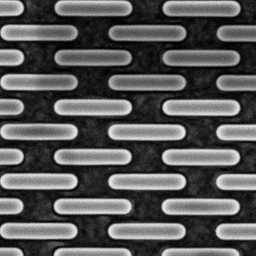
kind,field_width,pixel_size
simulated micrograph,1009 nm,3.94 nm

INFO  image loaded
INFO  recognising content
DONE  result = groups of lines, slits or small figures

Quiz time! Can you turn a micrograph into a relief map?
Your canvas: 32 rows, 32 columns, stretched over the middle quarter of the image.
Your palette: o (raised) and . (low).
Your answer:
................................
................................
................................
ooo.........oooooooooooooooooo..
ooo........ooooooooooooooooooo..
ooo........ooooooooooooooooooo..
................................
................................
................................
oooooooooooooooo.........ooooooo
ooooooooooooooooo........ooooooo
ooooooooooooooooo........ooooooo
oooooooooooooooo..........oooooo
................................
................................
oo..........ooooooooooooooooo...
ooo........ooooooooooooooooooo..
ooo........ooooooooooooooooooo..
oo..........oooooooooooooooooo..
................................
................................
oooooooooooooooo..........oooooo
ooooooooooooooooo........ooooooo
ooooooooooooooooo........ooooooo
oooooooooooooooo.........ooooooo
................................
................................
................................
ooo.........oooooooooooooooooo..
ooo........ooooooooooooooooooo..
ooo.........oooooooooooooooooo..
................................